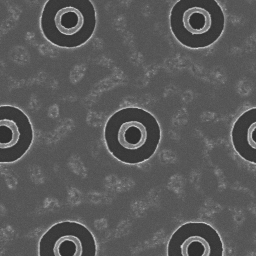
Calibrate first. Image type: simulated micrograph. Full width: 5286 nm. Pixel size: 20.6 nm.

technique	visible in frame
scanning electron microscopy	ring-shaped grooves with a dot in the middle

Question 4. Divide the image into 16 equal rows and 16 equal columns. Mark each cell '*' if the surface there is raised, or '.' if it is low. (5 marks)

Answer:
***...*****...**
***...*****...**
***..******..***
****************
****************
****************
****************
..*****...*****.
..*****...*****.
..*****...*****.
****************
****************
****************
****************
***...*****..***
***...*****...**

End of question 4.